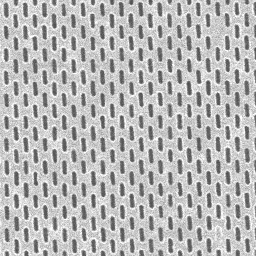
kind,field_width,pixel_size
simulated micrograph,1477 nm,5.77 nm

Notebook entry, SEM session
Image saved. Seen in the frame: a regular array of holes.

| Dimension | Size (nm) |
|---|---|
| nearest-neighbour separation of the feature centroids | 83.7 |